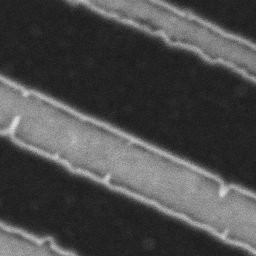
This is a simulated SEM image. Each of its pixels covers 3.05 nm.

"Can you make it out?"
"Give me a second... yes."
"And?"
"one or a few lines or trenches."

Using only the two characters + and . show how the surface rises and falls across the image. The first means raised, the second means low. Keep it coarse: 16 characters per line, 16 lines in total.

++++++.....+++++
+++++++++....+++
+++++++++++....+
+++++++++++++...
+++++++++++++++.
.+++++++++++++++
...+++++++++++++
.....+++++++++++
+.......++++++++
+++.......++++++
+++++.......++++
+++++++.......++
+++++++++.......
+++++++++++.....
.+++++++++++++..
...+++++++++++++